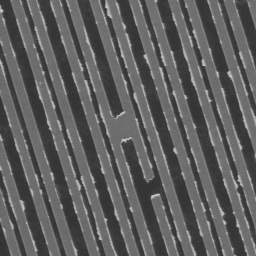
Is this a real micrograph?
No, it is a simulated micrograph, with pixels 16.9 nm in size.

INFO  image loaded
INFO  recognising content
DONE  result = parallel lines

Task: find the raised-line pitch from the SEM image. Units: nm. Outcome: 318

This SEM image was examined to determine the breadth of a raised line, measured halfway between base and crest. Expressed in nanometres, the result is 172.